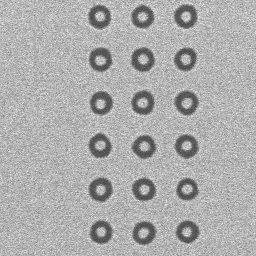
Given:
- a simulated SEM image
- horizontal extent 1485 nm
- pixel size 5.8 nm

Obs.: a regular array of ring-shaped grooves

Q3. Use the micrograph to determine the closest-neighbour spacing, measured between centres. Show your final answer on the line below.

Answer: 0.247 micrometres